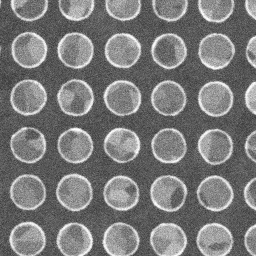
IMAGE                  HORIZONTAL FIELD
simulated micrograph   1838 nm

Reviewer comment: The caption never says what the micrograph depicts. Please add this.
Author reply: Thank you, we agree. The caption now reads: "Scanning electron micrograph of a regular array of raised bodies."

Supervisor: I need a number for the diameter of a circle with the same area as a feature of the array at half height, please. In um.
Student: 0.243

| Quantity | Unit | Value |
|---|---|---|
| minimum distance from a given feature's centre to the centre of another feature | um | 0.333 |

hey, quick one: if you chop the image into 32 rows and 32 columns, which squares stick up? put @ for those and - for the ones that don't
--@@@@--@@@@-@@@@--@@@@--@@@@--@
--@@@@--@@@---@@@--@@@@--@@@@--@
--------------------------@@----
--------------------------------
--@@@---@@@---@@----@@----@@----
--@@@@-@@@@--@@@@--@@@@--@@@@--@
--@@@@-@@@@@-@@@@--@@@@--@@@@--@
--@@@---@@@---@@@--@@@@--@@@@--@
--------------------------------
--------------------------------
--@@@---@@@---@@----@@----@@----
--@@@@-@@@@--@@@@--@@@@--@@@@--@
-@@@@@-@@@@@-@@@@--@@@@--@@@@--@
--@@@---@@@---@@@--@@@@--@@@@--@
--------------------------------
--------------------------------
--@@@---@@@---@@----@@----@@----
-@@@@@-@@@@--@@@@--@@@@--@@@@--@
-@@@@@-@@@@@-@@@@--@@@@--@@@@--@
--@@@---@@@---@@@--@@@@--@@@@--@
--------------------------------
--------------------------------
--@@@---@@@---@@----@@----@@----
-@@@@@-@@@@--@@@@--@@@@--@@@@--@
--@@@@-@@@@--@@@@--@@@@--@@@@--@
--@@@---@@@---@@@---@@@--@@@@--@
--------------------------------
--------------------------------
--@@@---@@@---@@---@@@---@@@---@
-@@@@--@@@@--@@@@--@@@@--@@@@--@
-@@@@@-@@@@--@@@@--@@@@--@@@@--@
--@@@---@@@---@@@---@@@--@@@---@